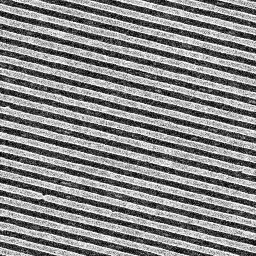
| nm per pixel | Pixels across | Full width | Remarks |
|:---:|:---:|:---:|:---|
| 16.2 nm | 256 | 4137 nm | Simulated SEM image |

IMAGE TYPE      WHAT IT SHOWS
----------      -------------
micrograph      parallel lines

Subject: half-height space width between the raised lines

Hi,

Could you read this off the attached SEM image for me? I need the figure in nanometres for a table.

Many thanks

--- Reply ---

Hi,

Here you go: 104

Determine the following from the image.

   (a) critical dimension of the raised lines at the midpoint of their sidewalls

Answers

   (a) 88.3 nm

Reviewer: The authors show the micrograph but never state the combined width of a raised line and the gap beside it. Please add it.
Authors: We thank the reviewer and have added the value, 12.4 pixels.